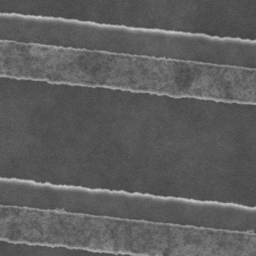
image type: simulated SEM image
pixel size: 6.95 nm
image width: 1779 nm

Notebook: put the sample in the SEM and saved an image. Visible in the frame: lines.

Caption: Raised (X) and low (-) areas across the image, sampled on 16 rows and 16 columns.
----------------
XXXXXX----------
XXXXXXXXXXXXXXX-
XXXXXXXXXXXXXXXX
XXXXXXXXXXXXXXXX
-------XXXXXXXXX
----------------
----------------
----------------
----------------
----------------
XXX-------------
XXXXXXXXXXXX----
XXXXXXXXXXXXXXXX
XXXXXXXXXXXXXXXX
----XXXXXXXXXXXX